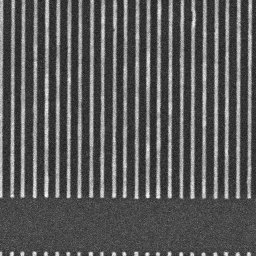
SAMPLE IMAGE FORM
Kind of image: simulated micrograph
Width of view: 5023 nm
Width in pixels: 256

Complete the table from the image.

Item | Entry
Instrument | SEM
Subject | parallel lines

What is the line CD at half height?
56.4 nm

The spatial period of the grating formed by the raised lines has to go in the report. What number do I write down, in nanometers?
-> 221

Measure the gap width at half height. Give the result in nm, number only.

172